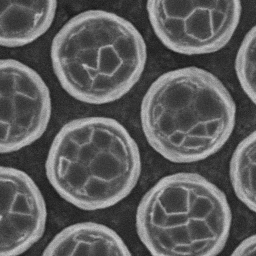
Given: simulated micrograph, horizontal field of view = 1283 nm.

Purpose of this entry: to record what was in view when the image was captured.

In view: raised bodies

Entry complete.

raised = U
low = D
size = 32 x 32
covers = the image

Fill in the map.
UUUUUUDDDDDDDDDDDDDUUUUUUUUUUUDD
UUUUUUDDDDDDDDDDDDDUUUUUUUUUUUDD
UUUUUUDDDDUUUUUDDDDUUUUUUUUUUDDD
UUUUUDDDUUUUUUUUDDDDUUUUUUUUUDDD
UUUUDDDDUUUUUUUUUDDDUUUUUUUUDDDU
DDDDDDDUUUUUUUUUUUDDDUUUUUUDDDDU
DDDDDDDUUUUUUUUUUUDDDDDDDDDDDDUU
DDDDDDDUUUUUUUUUUUDDDDDDDDDDDDUU
UUUDDDDUUUUUUUUUUDDDDDDDDDDDDDUU
UUUUDDDDUUUUUUUUUDDDDUUUUDDDDDUU
UUUUUDDDUUUUUUUUDDDDUUUUUUUDDDDU
UUUUUDDDDUUUUUUDDDDUUUUUUUUUDDDU
UUUUUUDDDDDDDDDDDDDUUUUUUUUUDDDD
UUUUUUDDDDDDDDDDDDUUUUUUUUUUUDDD
UUUUUUDDDDDDDDDDDDUUUUUUUUUUUDDD
UUUUUDDDDDUUUUDDDDUUUUUUUUUUUDDD
UUUUUDDDUUUUUUUUDDDUUUUUUUUUDDDD
UUUDDDDUUUUUUUUUDDDUUUUUUUUUDDDU
DDDDDDDUUUUUUUUUUDDDUUUUUUUDDDUU
DDDDDDDUUUUUUUUUUDDDDUUUUDDDDDUU
DDDDDDUUUUUUUUUUUDDDDDDDDDDDDUUU
UDDDDDUUUUUUUUUUUDDDDDDDDDDDDUUU
UUUDDDDUUUUUUUUUDDDDDUUUDDDDDDUU
UUUUDDDUUUUUUUUUDDDDUUUUUUDDDDUU
UUUUUDDDDUUUUUUDDDDUUUUUUUUDDDUU
UUUUUDDDDDDUUDDDDDUUUUUUUUUUDDDU
UUUUUDDDDDDDDDDDDDUUUUUUUUUUDDDD
UUUUUDDDDDDDDDDDDDUUUUUUUUUUDDDD
UUUUUDDDDDUUDDDDDDUUUUUUUUUUDDDD
UUUUDDDDUUUUUUDDDDUUUUUUUUUUDDDD
UUUDDDDUUUUUUUUDDDDUUUUUUUUDDDDU
UUDDDDUUUUUUUUUUDDDUUUUUUUUDDDUU